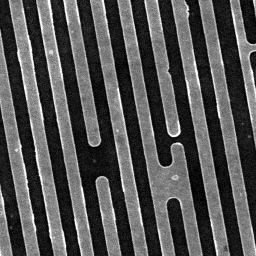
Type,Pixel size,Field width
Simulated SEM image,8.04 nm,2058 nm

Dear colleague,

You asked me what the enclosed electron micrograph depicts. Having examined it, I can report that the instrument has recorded parallel lines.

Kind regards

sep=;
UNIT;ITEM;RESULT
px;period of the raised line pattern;26.8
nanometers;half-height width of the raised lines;104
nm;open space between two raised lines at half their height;114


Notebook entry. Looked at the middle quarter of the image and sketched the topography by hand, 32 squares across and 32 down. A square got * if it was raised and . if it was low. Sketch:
...***...****...***....***....**
...***....***....***...***....**
...***....***....***...***....**
...***....***....***....***...**
...****...***....***....***....*
....***...****...***....***....*
....***....***...***....***....*
....***....***....***...***....*
....***....***....***...****...*
*...***....***....***....***...*
*....***...***....***....***....
*....***...****...***....***....
*....***....***...***....***....
*....***....***....***...****...
**...***....***....***....***...
**...****...***....***....***...
**....***...***....***....***...
**....***...****...***....***...
**....***....***....***.........
**....***....***....***.........
***....*.....***....***....***..
***..........***....***....***..
***..........****...***....***..
***...........***...***....***..
***...........***....***...***..
***...........***....***..*****.
.***..........***....**********.
.***..........***....**********.
.***.....*....****...**********.
.***....***...****...**********.
.***....***....***....**********
..***...***....***....**********